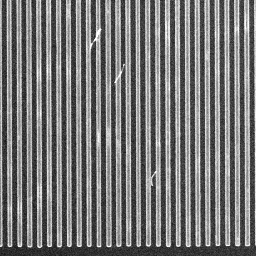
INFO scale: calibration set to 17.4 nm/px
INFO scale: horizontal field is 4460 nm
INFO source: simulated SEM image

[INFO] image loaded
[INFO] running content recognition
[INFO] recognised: parallel lines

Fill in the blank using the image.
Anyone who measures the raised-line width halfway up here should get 74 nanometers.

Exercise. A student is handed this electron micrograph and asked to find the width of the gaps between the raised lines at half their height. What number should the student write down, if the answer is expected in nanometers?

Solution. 98